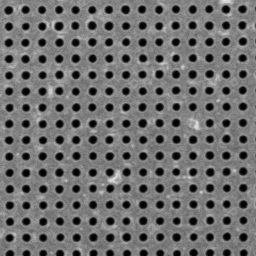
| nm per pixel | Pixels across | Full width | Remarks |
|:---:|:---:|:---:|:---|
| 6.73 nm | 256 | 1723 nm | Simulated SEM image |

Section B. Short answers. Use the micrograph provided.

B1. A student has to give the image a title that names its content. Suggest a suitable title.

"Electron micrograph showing a regular array of holes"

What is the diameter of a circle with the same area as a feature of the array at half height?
53.7 nm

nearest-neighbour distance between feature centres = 108 nanometres